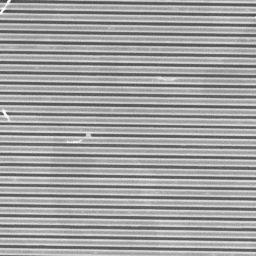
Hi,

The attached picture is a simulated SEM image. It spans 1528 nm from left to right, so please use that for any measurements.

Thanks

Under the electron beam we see parallel lines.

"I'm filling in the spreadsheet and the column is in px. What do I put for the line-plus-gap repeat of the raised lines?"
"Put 10.2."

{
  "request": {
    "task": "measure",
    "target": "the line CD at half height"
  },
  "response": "35.1 nanometers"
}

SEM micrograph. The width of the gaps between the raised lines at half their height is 23.9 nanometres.